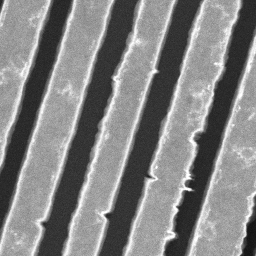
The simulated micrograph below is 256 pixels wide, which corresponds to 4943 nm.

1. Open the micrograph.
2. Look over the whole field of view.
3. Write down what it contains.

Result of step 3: one or a few lines or trenches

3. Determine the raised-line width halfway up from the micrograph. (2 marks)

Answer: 724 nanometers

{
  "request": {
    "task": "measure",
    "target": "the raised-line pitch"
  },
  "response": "1200 nanometres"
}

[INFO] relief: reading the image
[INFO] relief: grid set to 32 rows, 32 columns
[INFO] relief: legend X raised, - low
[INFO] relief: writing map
XXXXXX---XXXXX---XXXXX---XXXXX--
XXXXXX---XXXXX---XXXX----XXXXX--
XXXXXX--XXXXX----XXXX---XXXXXX--
XXXXX---XXXXX----XXXX---XXXXX---
XXXXX---XXXXX---XXXXX---XXXXX---
XXXXX---XXXXX---XXXX----XXXX----
XXXX---XXXXX----XXXX---XXXXX---X
XXXX---XXXXX---XXXXX---XXXXX---X
XXXX---XXXXX---XXXXX---XXXXX---X
XXX---XXXXX---XXXXX---XXXXXX--XX
XXX---XXXXX---XXXXX---XXXXX---XX
XXX---XXXXX---XXXX----XXXXX---XX
XXX--XXXXX----XXXX----XXXXX--XXX
XX---XXXXX----XXXX---XXXXX---XXX
XX---XXXXX---XXXX----XXXXX---XXX
XX--XXXXXX---XXXX----XXXXX--XXXX
X---XXXXX----XXXX---XXXXX---XXXX
X---XXXXX---XXXXX---XXXX----XXXX
X---XXXXX---XXXX----XXXXX---XXXX
X--XXXXX----XXXX---XXXXX---XXXXX
---XXXXX---XXXXX---XXXXX---XXXXX
---XXXXX---XXXX----XXXXX---XXXXX
--XXXXX----XXXX---XXXXXX--XXXXXX
--XXXXX---XXXXX---XXXXX---XXXXXX
--XXXXX---XXXX----XXXXX---XXXXXX
-XXXXX----XXXX----XXXX---XXXXXXX
-XXXXX---XXXXX---XXXXX---XXXXXXX
-XXXXX---XXXX----XXXXX---XXXXXX-
XXXXX----XXXX---XXXXXX--XXXXXXX-
XXXXX----XXXX---XXXXXX--XXXXXXX-
XXXXX---XXXXX---XXXXX---XXXXXX--
XXXX----XXXX----XXXX----XXXXXX--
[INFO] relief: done